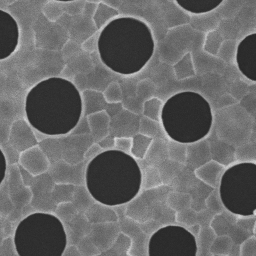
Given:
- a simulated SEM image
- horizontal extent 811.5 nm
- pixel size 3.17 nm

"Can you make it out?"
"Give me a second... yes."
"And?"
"holes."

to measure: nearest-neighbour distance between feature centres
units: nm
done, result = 297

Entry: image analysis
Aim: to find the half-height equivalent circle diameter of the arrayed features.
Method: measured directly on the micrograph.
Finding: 175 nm